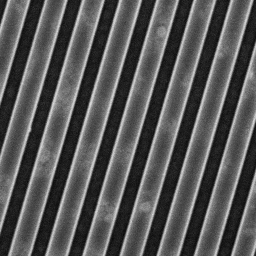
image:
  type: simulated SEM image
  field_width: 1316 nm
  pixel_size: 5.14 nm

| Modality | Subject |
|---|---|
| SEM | parallel lines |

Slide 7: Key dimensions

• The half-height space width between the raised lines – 0.0766 um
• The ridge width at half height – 107 nm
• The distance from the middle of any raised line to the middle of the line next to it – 184 nm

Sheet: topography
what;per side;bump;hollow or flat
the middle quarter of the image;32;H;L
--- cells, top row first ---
HHHHHLLLLHHHHHLLLLLHHHHHLLLLHHHH
HHHHHLLLLHHHHHLLLLHHHHHHLLLLHHHH
HHHHHLLLLHHHHHLLLLHHHHHLLLLHHHHH
HHHHLLLLHHHHHHLLLLHHHHHLLLLHHHHH
HHHHLLLLHHHHHLLLLHHHHHHLLLLHHHHH
HHHHLLLLHHHHHLLLLHHHHHLLLLHHHHHH
HHHLLLLLHHHHHLLLLHHHHHLLLLHHHHHL
HHHLLLLHHHHHHLLLLHHHHHLLLLHHHHHL
HHHLLLLHHHHHLLLLHHHHHHLLLLHHHHHL
HHHLLLLHHHHHLLLLHHHHHLLLLHHHHHHL
HHLLLLHHHHHHLLLLHHHHHLLLLHHHHHLL
HHLLLLHHHHHLLLLHHHHHHLLLLHHHHHLL
HHLLLLHHHHHLLLLHHHHHLLLLHHHHHHLL
HLLLLLHHHHHLLLLHHHHHLLLLHHHHHLLL
HLLLLHHHHHHLLLLHHHHHLLLLHHHHHLLL
HLLLLHHHHHLLLLHHHHHHLLLHHHHHHLLL
HLLLLHHHHHLLLLHHHHHLLLLHHHHHHLLL
LLLLHHHHHHLLLLHHHHHLLLLHHHHHLLLL
LLLLHHHHHLLLLHHHHHHLLLLHHHHHLLLL
LLLLHHHHHLLLLHHHHHLLLLHHHHHHLLLL
LLLLHHHHHLLLLHHHHHLLLLHHHHHLLLLH
LLLHHHHHHLLLHHHHHHLLLLHHHHHLLLLH
LLLHHHHHLLLLHHHHHHLLLHHHHHHLLLLH
LLLHHHHHLLLLHHHHHLLLLHHHHHHLLLHH
LLHHHHHHLLLLHHHHHLLLLHHHHHLLLLHH
LLHHHHHLLLLHHHHHHLLLLHHHHHLLLLHH
LLHHHHHLLLLHHHHHLLLLHHHHHHLLLLHH
LLHHHHHLLLLHHHHHLLLLHHHHHLLLLHHH
LHHHHHHLLLHHHHHHLLLLHHHHHLLLLHHH
LHHHHHLLLLHHHHHHLLLHHHHHHLLLLHHH
LHHHHHLLLLHHHHHLLLLHHHHHHLLLHHHH
HHHHHHLLLLHHHHHLLLLHHHHHLLLLHHHH